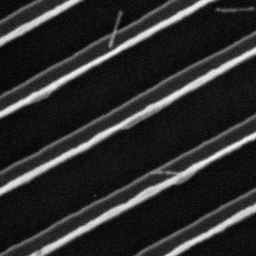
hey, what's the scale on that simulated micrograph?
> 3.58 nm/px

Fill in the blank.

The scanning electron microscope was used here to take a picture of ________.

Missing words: lines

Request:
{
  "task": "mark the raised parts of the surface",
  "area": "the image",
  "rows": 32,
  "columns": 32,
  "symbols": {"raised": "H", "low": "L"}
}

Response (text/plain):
LLLLHHHHHLLLLLLLLLLLLHHHHHLLLLLL
LLHHHHHHLLLLLLLLLLLHHHHHLLLLLLLL
HHHHHHLLLLLLLLLLLHHHHHLLLLLLLLLL
HHHHLLLLLLLLLLLLHHHHLLLLLLLLLLLL
HHLLLLLLLLLLLHHHHHLLLLLLLLLLLLLH
LLLLLLLLLLLHHHHHHLLLLLLLLLLLLHHH
LLLLLLLLLLHHHHHLLLLLLLLLLLLHHHHH
LLLLLLLLHHHHHLLLLLLLLLLLLHHHHHLL
LLLLLLHHHHHLLLLLLLLLLLLHHHHHHLLL
LLLLLHHHHLLLLLLLLLLLLLHHHHHLLLLL
LLLHHHHHLLLLLLLLLLLLHHHHHLLLLLLL
LHHHHHHLLLLLLLLLLLHHHHHLLLLLLLLL
HHHHHLLLLLLLLLLLHHHHHHLLLLLLLLLL
HHLLLLLLLLLLLLLHHHHHLLLLLLLLLLLL
LLLLLLLLLLLLLHHHHHHLLLLLLLLLLLLL
LLLLLLLLLLLHHHHHHLLLLLLLLLLLLLHH
LLLLLLLLLHHHHHLLLLLLLLLLLLLLHHHH
LLLLLLLHHHHHLLLLLLLLLLLLLLHHHHHL
LLLLLLHHHHHLLLLLLLLLLLLLHHHHHHLL
LLLLHHHHHLLLLLLLLLLLLLLHHHHLLLLL
LLHHHHHLLLLLLLLLLLLLLHHHHHLLLLLL
HHHHHLLLLLLLLLLLLLLHHHHHLLLLLLLL
HHHHLLLLLLLLLLLLLHHHHHHLLLLLLLLL
HHLLLLLLLLLLLLLHHHHHLLLLLLLLLLLL
LLLLLLLLLLLLLHHHHHHLLLLLLLLLLLHH
LLLLLLLLLLLLHHHHHLLLLLLLLLLLHHHH
LLLLLLLLLLHHHHHLLLLLLLLLLLLHHHHH
LLLLLLLLHHHHHLLLLLLLLLLLLHHHHHLL
LLLLLLHHHHHLLLLLLLLLLLLHHHHHLLLL
LLLLHHHHHLLLLLLLLLLLLHHHHHLLLLLL
LLHHHHHHLLLLLLLLLLLHHHHHLLLLLLLL
LHHHHHLLLLLLLLLLLLHHHHHLLLLLLLLL